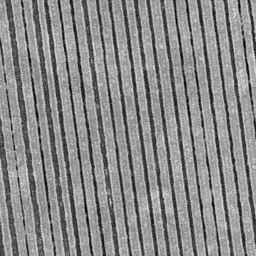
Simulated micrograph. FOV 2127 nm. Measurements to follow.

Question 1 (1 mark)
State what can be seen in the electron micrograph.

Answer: parallel lines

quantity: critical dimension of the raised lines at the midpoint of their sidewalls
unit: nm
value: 66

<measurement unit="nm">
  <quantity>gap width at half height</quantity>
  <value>40.1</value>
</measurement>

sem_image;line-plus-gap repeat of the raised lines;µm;0.105